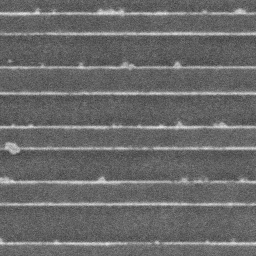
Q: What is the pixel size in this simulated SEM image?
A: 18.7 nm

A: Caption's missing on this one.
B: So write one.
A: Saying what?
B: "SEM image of lines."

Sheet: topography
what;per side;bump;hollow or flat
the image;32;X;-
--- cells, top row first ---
--------------------------------
--------------------------------
XXXXXXXXXXXXXXXXXXXXXXXXXXXXXXXX
XXXXXXXXXXXXXXXXXXXXXXXXXXXXXXXX
--------------------------------
--------------------------------
--------------------------------
--------------------------------
XXXXXXXXXXXXXXXXXXXXXXXXXXXXXXXX
XXXXXXXXXXXXXXXXXXXXXXXXXXXXXXXX
XXXXXXXXXXXXXXXXXXXXXXXXXXXXXXXX
XXXXXXXXXXXXXXXXXXXXXXXXXXXXXXXX
--------------------------------
--------------------------------
--------------------------------
--------------------------------
XXXXXXXXXXXXXXXXXXXXXXXXXXXXXXXX
XXXXXXXXXXXXXXXXXXXXXXXXXXXXXXXX
XXXXXXXXXXXXXXXXXXXXXXXXXXXXXXXX
--------------------------------
--------------------------------
--------------------------------
--------------------------------
XXXXXXXXXXXXXXXXXXXXXXXXXXXXXXXX
XXXXXXXXXXXXXXXXXXXXXXXXXXXXXXXX
XXXXXXXXXXXXXXXXXXXXXXXXXXXXXXXX
--------------------------------
--------------------------------
--------------------------------
--------------------------------
XXXXXXXXXXXXXXXXXXXXXXXXXXXXXXXX
XXXXXXXXXXXXXXXXXXXXXXXXXXXXXXXX